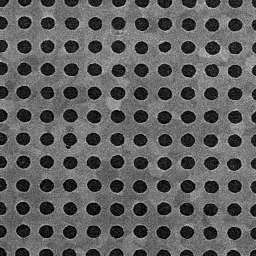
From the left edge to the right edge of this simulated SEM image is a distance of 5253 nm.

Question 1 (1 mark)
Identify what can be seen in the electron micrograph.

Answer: a regular array of holes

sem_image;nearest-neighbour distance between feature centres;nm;468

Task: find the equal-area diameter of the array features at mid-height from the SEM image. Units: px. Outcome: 14